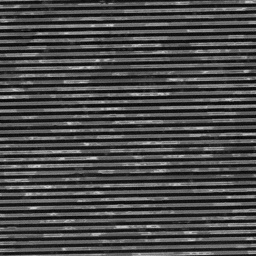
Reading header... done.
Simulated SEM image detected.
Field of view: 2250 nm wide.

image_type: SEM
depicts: parallel lines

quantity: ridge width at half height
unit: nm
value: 27.5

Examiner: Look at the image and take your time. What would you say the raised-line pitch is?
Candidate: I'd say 61.2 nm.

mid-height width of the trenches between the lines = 34 nanometers